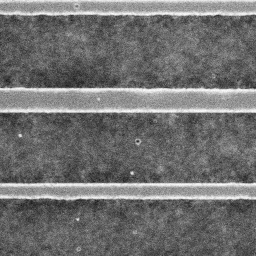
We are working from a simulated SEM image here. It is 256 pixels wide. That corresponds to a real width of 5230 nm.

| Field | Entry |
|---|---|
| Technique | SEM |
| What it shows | lines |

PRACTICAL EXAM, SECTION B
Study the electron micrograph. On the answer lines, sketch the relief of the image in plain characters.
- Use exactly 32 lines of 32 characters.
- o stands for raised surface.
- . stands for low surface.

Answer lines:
oooooooooooooooooooooooooooooooo
oooooooooooooooooooooooooooooooo
................................
................................
................................
................................
................................
................................
................................
................................
................................
oooooooooooooooooooooooooooooooo
oooooooooooooooooooooooooooooooo
oooooooooooooooooooooooooooooooo
................................
................................
................................
................................
................................
................................
................................
................................
................................
oooooooooooooooooooooooooooooooo
oooooooooooooooooooooooooooooooo
................................
................................
................................
................................
................................
................................
................................